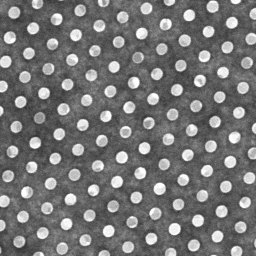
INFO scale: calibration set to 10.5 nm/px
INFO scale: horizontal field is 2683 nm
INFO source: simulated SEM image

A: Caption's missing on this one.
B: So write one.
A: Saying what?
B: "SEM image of a regular array of raised bodies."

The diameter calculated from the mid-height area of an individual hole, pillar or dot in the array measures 118 nanometres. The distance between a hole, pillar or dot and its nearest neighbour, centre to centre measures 258 nanometres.